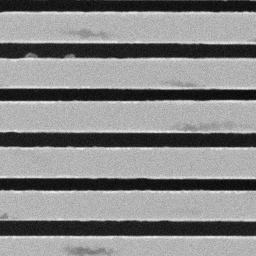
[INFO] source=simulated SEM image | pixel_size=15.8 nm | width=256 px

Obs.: lines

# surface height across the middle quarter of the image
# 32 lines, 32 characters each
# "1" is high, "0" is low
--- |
11111111111111111111111111111111
11111111111111111111111111111111
11111111111111111111111111111111
11111111111111111111111111111111
11111111111111111111111111111111
11111111111111111111111111111111
00000000000000000000000000000000
00000000000000000000000000000000
00000000000000000000000000000000
11111111111111111111111111111111
11111111111111111111111111111111
11111111111111111111111111111111
11111111111111111111111111111111
11111111111111111111111111111111
11111111111111111111111111111111
11111111111111111111111111111111
11111111111111111111111111111111
00000000000000000000000000000000
00000000000000000000000000000000
00000000000000000000000000000000
00000000000000000000000000000000
11111111111111111111111111111111
11111111111111111111111111111111
11111111111111111111111111111111
11111111111111111111111111111111
11111111111111111111111111111111
11111111111111111111111111111111
11111111111111111111111111111111
00000001000000010000011111111111
00000000000000000000000000000000
00000000000000000000000000000000
00000000000000000000000000000000